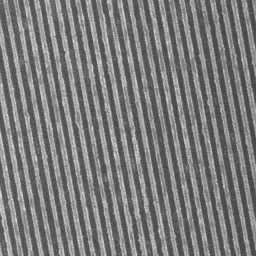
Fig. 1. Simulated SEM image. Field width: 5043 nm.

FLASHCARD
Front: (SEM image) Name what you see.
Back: parallel lines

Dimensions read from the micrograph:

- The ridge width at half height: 75.1 nm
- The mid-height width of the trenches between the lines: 128 nanometers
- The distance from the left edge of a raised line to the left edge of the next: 201 nm